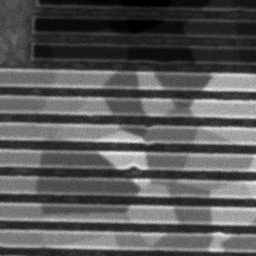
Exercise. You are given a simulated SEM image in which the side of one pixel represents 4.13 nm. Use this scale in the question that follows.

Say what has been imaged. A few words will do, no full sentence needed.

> parallel lines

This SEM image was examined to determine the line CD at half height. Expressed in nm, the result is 66.6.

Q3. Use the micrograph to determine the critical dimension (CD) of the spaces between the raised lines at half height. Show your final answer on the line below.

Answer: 42.4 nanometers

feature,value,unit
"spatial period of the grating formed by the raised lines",111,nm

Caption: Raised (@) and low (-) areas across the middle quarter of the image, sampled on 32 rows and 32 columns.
--------------------------------
--------------------------------
@@@@@@@@@@@@@@@@@@@@@@@@@@@@@@@@
@@@@@@@@@@@@@@@@@@@@@@@@@@@@@@@@
@@@@@@@@@@@@@@@@@@@@@@@@@@@@@@@@
@@@@@@@@@@@@@@@@@@@@@@@@@@@@@@@@
--------------------------------
--------------------------------
--@@@---------------------------
@@@@@@@@@@@@@@@@@@@@@@@@@@@@@@@@
@@@@@@@@@@@@@@@@@@@@@@@@@@@@@@@@
@@@@@@@@@@@@@@@@@@@@@@@@@@@@@@@@
-----@@@@@@-@@@@@@@@@@@@@@@@@@@@
--------------------------------
--------------------------------
@@@@@@@-@@@@@@@@----------------
@@@@@@@@@@@@@@@@@@@@@@@@@@@@@@@@
@@@@@@@@@@@@@@@@@@@@@@@@@@@@@@@@
@@@@@@@@@@@@@@@@@@@@@@@@@@@@@@@@
--------------------@@--@@@@@@@@
--------------------------------
--------------------------------
@@@@@@@@@@@@@@@@@@@@@@@@@@------
@@@@@@@@@@@@@@@@@@@@@@@@@@@@@@@@
@@@@@@@@@@@@@@@@@@@@@@@@@@@@@@@@
@@@@@@@@@@@@@@@@@-@@@@@@@@@@@@@@
--------------------------------
--------------------------------
--------------------------------
@@@@@@@@@@@@@@@@@@@@@@@@@@@@@@@@
@@@@@@@@@@@@@@@@@@@@@@@@@@@@@@@@
@@@@@@@@@@@@@@@@@@@@@@@@@@@@@@@@